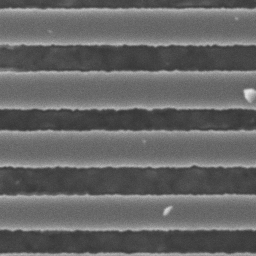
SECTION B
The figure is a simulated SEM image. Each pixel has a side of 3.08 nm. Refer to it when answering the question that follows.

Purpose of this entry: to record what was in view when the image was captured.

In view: lines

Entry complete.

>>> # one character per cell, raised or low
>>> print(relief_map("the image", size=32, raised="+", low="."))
................................
++++++++++++++++++++++++++++++++
++++++++++++++++++++++++++++++++
++++++++++++++++++++++++++++++++
++++++++++++++++++++++++++++++++
++++++++++++++++++++++++++++++++
................................
................................
................................
++++++++++++++++++++++++++++++++
++++++++++++++++++++++++++++++++
++++++++++++++++++++++++++++++++
++++++++++++++++++++++++++++++++
+++++++++++++++++++++.++++++++++
................................
................................
++++++++++++++++++++++++++++++++
++++++++++++++++++++++++++++++++
++++++++++++++++++++++++++++++++
++++++++++++++++++++++++++++++++
++++++++++++++++++++++++++++++++
................................
................................
................................
+.+.++.++++.++++++++++++++++++++
++++++++++++++++++++++++++++++++
++++++++++++++++++++++++++++++++
++++++++++++++++++++++++++++++++
++++++++++++++++++++++++++++++++
................................
................................
................................